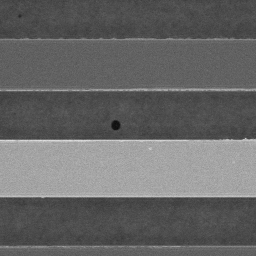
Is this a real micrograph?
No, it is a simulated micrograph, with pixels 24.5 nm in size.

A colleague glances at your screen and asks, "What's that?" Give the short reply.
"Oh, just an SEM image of lines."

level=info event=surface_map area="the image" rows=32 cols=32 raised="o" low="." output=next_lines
................................
................................
................................
................................
................................
oooooooooooooooooooooooooooooooo
oooooooooooooooooooooooooooooooo
oooooooooooooooooooooooooooooooo
oooooooooooooooooooooooooooooooo
oooooooooooooooooooooooooooooooo
oooooooooooooooooooooooooooooooo
................................
................................
................................
................................
................................
................................
................................
oooooooooooooooooooooooooooooooo
oooooooooooooooooooooooooooooooo
oooooooooooooooooooooooooooooooo
oooooooooooooooooooooooooooooooo
oooooooooooooooooooooooooooooooo
oooooooooooooooooooooooooooooooo
oooooooooooooooooooooooooooooooo
................................
................................
................................
................................
................................
................................
oooooooooooooooooooooooooooooooo